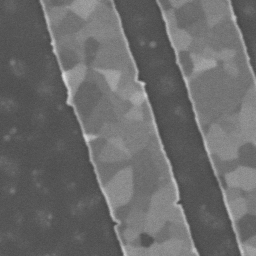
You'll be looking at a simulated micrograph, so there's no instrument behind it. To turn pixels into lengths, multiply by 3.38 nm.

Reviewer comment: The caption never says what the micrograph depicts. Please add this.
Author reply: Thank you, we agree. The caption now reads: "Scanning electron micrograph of one or a few lines or trenches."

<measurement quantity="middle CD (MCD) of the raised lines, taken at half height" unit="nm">236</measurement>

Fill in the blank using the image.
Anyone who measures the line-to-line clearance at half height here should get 0.141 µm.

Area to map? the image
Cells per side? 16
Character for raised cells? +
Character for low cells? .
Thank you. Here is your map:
...++++...++++..
...+++++..+++++.
...+++++...++++.
....++++...++++.
....+++++..+++++
....+++++...++++
....+++++...++++
.....+++++..++++
.....+++++...+++
......++++...+++
......+++++..+++
......+++++...++
.......++++...++
.......+++++..++
.......+++++...+
........++++...+